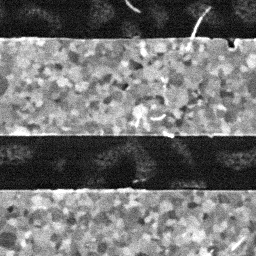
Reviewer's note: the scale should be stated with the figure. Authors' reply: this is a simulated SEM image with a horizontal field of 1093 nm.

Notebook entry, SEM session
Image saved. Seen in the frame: one or a few lines or trenches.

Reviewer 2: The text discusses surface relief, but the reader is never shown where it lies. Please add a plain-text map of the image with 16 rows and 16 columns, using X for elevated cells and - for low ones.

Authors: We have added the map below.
----------------
----------------
XXXXXXXXXXXXXX-X
XXXXXXXXXXXXXXXX
XXXXXXXXXXXXXXXX
XXXXXXXXXXXXXXXX
XXXXXXXXXXXXXXXX
XXXXXXXXXXXXXXXX
----------------
----------------
----------------
----------------
XXXXXXXXXXXXXXXX
XXXXXXXXXXXXXXXX
XXXXXXXXXXXXXXXX
XXXXXXXXXXXXXXXX